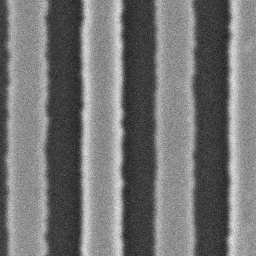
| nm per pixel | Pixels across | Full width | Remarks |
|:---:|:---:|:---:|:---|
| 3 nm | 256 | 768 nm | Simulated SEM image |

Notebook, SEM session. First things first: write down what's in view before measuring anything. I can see lines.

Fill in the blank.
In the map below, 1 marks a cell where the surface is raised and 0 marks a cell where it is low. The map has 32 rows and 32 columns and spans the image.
01111100000111100001111100000111
01111100000111100000111100000111
01111100000111100000111100000111
01111100001111100000111100000111
01111100001111100000111100000111
01111100001111100000111100000111
01111100001111100000111100000111
01111100001111100000111100000111
01111100001111100000111100000111
01111100001111100000111100000111
01111100001111100000111100000111
01111100001111100000111100000111
01111100001111100000111100000111
01111100000111100000111100000111
01111100001111100000111100000111
01111100001111100000111100000111
01111100001111100000111100000111
01111100001111100001111100000111
01111000001111100000111100000111
01111100001111100000111100000111
01111100001111100000111100000111
01111100001111100000111100000111
01111100001111100000111100000111
01111100001111100000111100000111
01111100001111100001111100000111
01111100001111100000111100000111
01111100001111100000111100000111
01111100001111100001111100000111
01111100001111100001111100000111
01111100001111100001111100000111
01111100001111100001111100000111
01111100001111100001111100000111